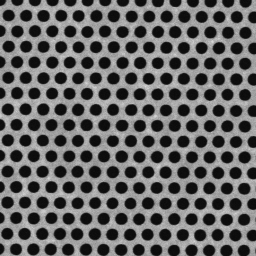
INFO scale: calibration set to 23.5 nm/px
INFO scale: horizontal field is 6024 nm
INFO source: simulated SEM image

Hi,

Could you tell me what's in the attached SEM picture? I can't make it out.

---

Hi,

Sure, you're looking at a regular array of holes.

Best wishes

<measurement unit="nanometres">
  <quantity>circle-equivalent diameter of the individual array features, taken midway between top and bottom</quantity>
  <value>286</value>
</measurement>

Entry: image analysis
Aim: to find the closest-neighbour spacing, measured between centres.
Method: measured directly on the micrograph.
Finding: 409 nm